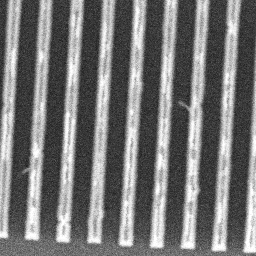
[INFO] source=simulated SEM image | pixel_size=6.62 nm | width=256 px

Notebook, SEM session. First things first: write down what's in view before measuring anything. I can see parallel lines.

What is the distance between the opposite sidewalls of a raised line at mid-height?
63.6 nanometres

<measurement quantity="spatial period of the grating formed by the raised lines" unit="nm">207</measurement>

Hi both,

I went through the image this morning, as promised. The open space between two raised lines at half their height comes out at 139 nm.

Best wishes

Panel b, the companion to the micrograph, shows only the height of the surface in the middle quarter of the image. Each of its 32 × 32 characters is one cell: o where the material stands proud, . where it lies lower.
.oo......oo......oo......oo.....
.oo......oo......oo......oo.....
.oo......oo......oo......oo.....
.oo......oo......oo......oo.....
.oo......oo......oo......oo.....
.oo......oo......oo.....ooo.....
.oo......oo......oo.....ooo.....
.oo......oo.....ooo.....ooo.....
.oo......oo.....ooo.....oo......
.oo.....ooo.....ooo.....ooo.....
.oo.....ooo......o......ooo.....
ooo.....ooo.....oo......oo......
ooo.....ooo.....oo......oo......
ooo.....ooo.....oo......oo......
ooo.....ooo.....oo......oo......
ooo.....ooo.....oo......oo......
ooo.....oo......oo......oo.....o
ooo.....oo......oo......oo......
oo......oo......oo......oo......
oo......oo......oo......oo.....o
oo......oo......oo......oo.....o
oo......oo......oo.....ooo.....o
oo......oo......oo.....ooo.....o
oo......oo......oo.....ooo.....o
oo......oo.....ooo.....ooo.....o
oo......oo.....ooo.....ooo.....o
oo.....ooo.....ooo.....ooo.....o
oo.....ooo.....ooo.....ooo.....o
oo.....ooo.....ooo.....oo......o
oo.....ooo.....ooo.....oo......o
oo.....ooo.....ooo.....oo......o
oo.....ooo.....oo......oo......o